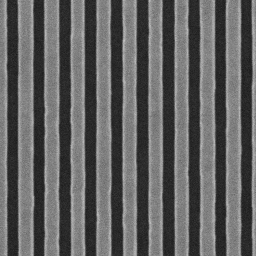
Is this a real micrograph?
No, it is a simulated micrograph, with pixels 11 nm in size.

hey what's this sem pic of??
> wiring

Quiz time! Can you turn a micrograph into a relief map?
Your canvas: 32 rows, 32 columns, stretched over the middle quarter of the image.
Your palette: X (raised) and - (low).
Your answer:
--XXX---XXX----XXX---XXXX---XXX-
--XXX---XXX----XXX---XXXX---XXX-
--XXX---XXX----XXX---XXXX---XXX-
--XXX---XXX----XXX---XXXX---XXX-
--XXX---XXX----XXX---XXXX---XXX-
--XXX---XXX----XXX---XXXX---XXX-
--XXX---XXXX---XXX---XXXX---XXX-
--XXX---XXXX---XXX---XXXX---XXX-
--XXX---XXX----XXX---XXXX---XXX-
--XXX---XXX----XXX---XXXX---XXX-
--XXX---XXX----XXX---XXXX---XXX-
--XXX---XXX----XXX---XXXX---XXX-
--XXX---XXX----XXX---XXXX---XXX-
--XXX---XXX----XXX---XXXX---XXX-
--XXX---XXX----XXX---XXXX---XXX-
--XXX---XXX----XXX---XXXX---XXX-
--XXX---XXXX---XXX---XXXX---XXX-
--XXX---XXXX---XXX---XXXX---XXX-
--XXX---XXXX---XXX---XXXX---XXX-
--XXX---XXXX---XXX---XXXX---XXX-
--XXX---XXXX---XXX---XXXX---XXX-
--XXX---XXXX---XXX---XXXX---XXX-
--XXX---XXXX---XXX---XXXX---XXX-
--XXX---XXXX---XXX---XXXX---XXX-
--XXX---XXXX---XXX---XXXX---XXX-
--XXX---XXXX---XXX---XXXX---XXX-
--XXX---XXXX---XXX---XXXX---XXX-
--XXX---XXXX---XXX---XXXX---XXX-
--XXX---XXXX---XXX---XXXX---XXX-
--XXX---XXXX---XXX---XXXX---XXX-
--XXX---XXXX---XXX---XXXX---XXX-
--XXX---XXXX---XXX---XXXX---XXX-